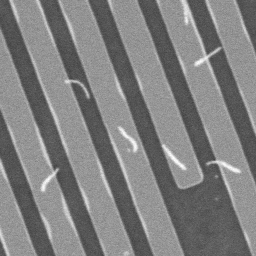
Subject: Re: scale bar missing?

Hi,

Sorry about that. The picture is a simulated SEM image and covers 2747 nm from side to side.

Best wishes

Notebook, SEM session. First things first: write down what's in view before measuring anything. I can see groups of lines, slits or small figures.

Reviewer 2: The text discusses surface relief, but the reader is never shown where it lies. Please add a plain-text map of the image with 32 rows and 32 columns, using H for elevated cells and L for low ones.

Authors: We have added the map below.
LHHHHLLHHHHLLLHHHLLLHHHLLLHHHHLL
LLHHHLLLHHHLLLHHHHLLHHHHLLHHHHLL
LLHHHHLLHHHHLLHHHHLLHHHHLLLHHHLL
LLHHHHLLLHHHLLLHHHLLLHHHLLLHHHHL
LLLHHHLLLHHHHLLHHHHLLHHHHLLHHHHL
HLLHHHHLLHHHHLLHHHHLLLHHHLLLHHHL
HLLLHHHLLLHHHLLLHHHLLLHHHHLLHHHH
HLLLHHHHLLHHHHLLHHHHLLHHHHLLLHHH
HHLLHHHHLLLHHHLLLHHHLLLHHHLLLHHH
HHLLLHHHLLLHHHLLLHHHHLLHHHHLLHHH
HHHLLHHHHLLHHHHLLHHHHLLLHHHLLLHH
HHHLLLHHHLLLHHHLLLHHHLLLHHHLLLHH
HHHLLLHHHHLLHHHHLLHHHHLLHHHHLLHH
HHHHLLHHHHLLHHHHLLHHHHLLLHHHLLLH
HHHHLLLHHHLLLHHHLLLHHHHLLHHHHLLH
LHHHLLLHHHHLLHHHHLLHHHHLLHHHHLLL
LHHHHLLHHHHLLLHHHLLLHHHLLLHHHLLL
LLHHHLLLHHHLLLHHHHLLHHHHLLHHHHLL
LLHHHLLLHHHHLLHHHHLLHHHHLLHHHHLL
LLHHHHLLHHHHLLLHHHLLLHHHLLLHHHHL
LLLHHHLLLHHHLLLHHHHLLHHHHLLHHHHL
LLLHHHHLLHHHHLLLHHHLLHHHHLLLHHHL
HLLLHHHLLLHHHLLLHHHLLLHHHLLLHHHH
HLLLHHHLLLHHHLLLHHHHLLLLLLLLLHHH
HHLLHHHHLLLHHHLLLHHHLLLLLLLLLHHH
HHLLLHHHLLLHHHLLLHHHLLLLLLLLLHHH
HHLLLHHHLLLHHHHLLHHHHLLLLLLLLLHH
HHHLLHHHHLLHHHHLLLHHHLLLLLLLLLHH
HHHLLLHHHLLLHHHLLLHHHHLLLLLLLLHH
HHHHLLHHHHLLHHHHLLHHHHLLLLLLLLLH
HHHHLLHHHHLLLHHHLLLHHHLLLLLLLLLH
LHHHLLLHHHHLLHHHHLLHHHHLLLLLLLLH